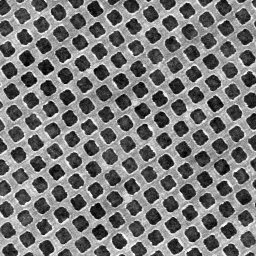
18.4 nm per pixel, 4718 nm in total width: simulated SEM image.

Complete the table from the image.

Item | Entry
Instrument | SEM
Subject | a regular array of holes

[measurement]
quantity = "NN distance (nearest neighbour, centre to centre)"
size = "0.386 microns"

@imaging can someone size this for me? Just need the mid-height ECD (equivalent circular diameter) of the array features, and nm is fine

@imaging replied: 293